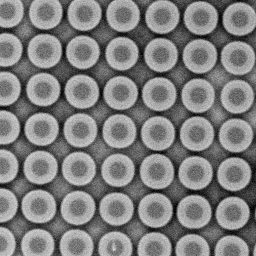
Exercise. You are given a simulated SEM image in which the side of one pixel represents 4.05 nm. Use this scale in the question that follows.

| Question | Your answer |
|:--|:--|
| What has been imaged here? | an array of small figures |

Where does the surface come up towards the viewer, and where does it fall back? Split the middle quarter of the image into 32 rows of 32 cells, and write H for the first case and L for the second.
LLHHHHHLLLLLHHHHHLLLLHHHHHHLLLLH
LLLLLLLLLLLLLLLLLLLLLLLHHHLLLLLL
LLLLLLLLLLLLLLLLLLLLLLLLLLLLLLLL
LLHHHHHLLLLLHHHHLLLLLLLLLLLLLLLL
LHHHHHHHLLLHHHHHHLLLLHHHHHHLLLLH
HHHHHHHHLLHHHHHHHHLLHHHHHHHLLLHH
HHHHHHHHHLHHHHHHHHLLHHHHHHHHLLHH
HHHHHHHHHLHHHHHHHHLLHHHHHHHHLLHH
LHHHHHHHLLHHHHHHHHLLHHHHHHHHLLHH
LHHHHHHHLLLHHHHHHHLLHHHHHHHLLLHH
LLLHHHHLLLLHHHHHHLLLLHHHHHHLLLHH
LLLLLLLLLLLLLLLLLLLLLLLHHLLLLLLH
LLLLLLLLLLLLLLLLLLLLLLLLLLLLLLLL
LHHHHHHLLLLHHHHHLLLLLLHHHLLLLLLL
HHHHHHHHLLHHHHHHHLLLHHHHHHLLLLHH
HHHHHHHHLLHHHHHHHHLLHHHHHHHLLLHH
HHHHHHHHLLHHHHHHHHLLHHHHHHHHLHHH
HHHHHHHHLLHHHHHHHHLHHHHHHHHHLHHH
LHHHHHHHLLHHHHHHHHLHHHHHHHHLLHHH
LHHHHHHLLLLHHHHHHLLLHHHHHHHLLHHH
LLLHHLLLLLLLHHHHLLLLLHHHHHLLLLHH
LLLLLLLLLLLLLLLLLLLLLLLLHLLLLLLL
LLHHHLLLLLLLLLLLLLLLLLLLLLLLLLLL
LHHHHHHLLLLHHHHHLLLLLHHHHHLLLLLH
HHHHHHHLLLHHHHHHHLLLHHHHHHHLLLHH
HHHHHHHHLLHHHHHHHLLHHHHHHHHLLHHH
HHHHHHHHLHHHHHHHHHLHHHHHHHHLLHHH
HHHHHHHHLLHHHHHHHLLHHHHHHHHLLHHH
HHHHHHHLLLHHHHHHHLLHHHHHHHHLLHHH
LHHHHHLLLLLHHHHHLLLLHHHHHHHLLHHH
LLLLLLLLLLLLLLLLLLLLLHHHHHLLLLHH
LLLLLLLLLLLLLLLLLLLLLLLLLLLLLLLL